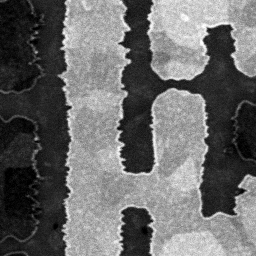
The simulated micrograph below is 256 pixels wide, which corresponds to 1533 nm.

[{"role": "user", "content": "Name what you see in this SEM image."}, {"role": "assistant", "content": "one or a few lines or trenches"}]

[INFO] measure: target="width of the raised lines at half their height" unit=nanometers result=317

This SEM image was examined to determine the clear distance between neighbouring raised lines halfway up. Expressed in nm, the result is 189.